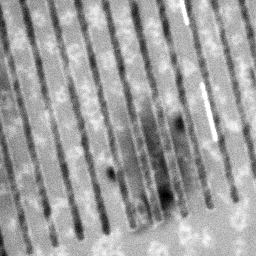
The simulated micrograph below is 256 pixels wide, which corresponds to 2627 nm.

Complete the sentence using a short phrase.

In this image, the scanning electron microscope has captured parallel lines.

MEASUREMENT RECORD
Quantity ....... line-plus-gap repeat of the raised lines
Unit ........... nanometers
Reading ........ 272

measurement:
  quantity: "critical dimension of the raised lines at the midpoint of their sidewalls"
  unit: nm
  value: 90.9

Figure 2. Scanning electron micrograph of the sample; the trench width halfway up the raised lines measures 181 nanometers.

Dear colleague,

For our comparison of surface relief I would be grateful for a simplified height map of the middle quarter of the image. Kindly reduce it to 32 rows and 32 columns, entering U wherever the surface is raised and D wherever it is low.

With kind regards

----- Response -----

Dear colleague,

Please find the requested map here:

UUDDDDUUDDDDDUUDDDDDUUDDDDDUUDDD
UUDDDDDUUDDDDUUUDDDDUUUDDDDUUDDD
UUDDDDDUUDDDDDUUDDDDUUUDDDDUUUDD
UUUDDDDUUDDDDDUUDDDDDUUDDDDUUUDD
UUUDDDDUUDDDDDUUDDDDDUUDDDDDUUDD
UUUDDDDDUUDDDDUUUDDDDUUUDDDDUUDD
DUUDDDDDUUDDDDDUUDDDDUUUDDDDUUUD
DUUUDDDDUUDDDDDUUDDDDDUUDDDDUUUD
DUUUDDDDUUDDDDDUUDDDDDUUDUDDDUUD
DUUUDDDDUUUDDDDUUUDDDDUUUDDUDUUD
DDUUDDDDDUUDDDDDUUDDDDUUUDDUDUUU
DDUUDDDDDUUDDDDDUUDDDDDUUDDDDUUU
DDUUUDDDDUUDDDDDUUDDDDDUUDDDDDUU
DDDUUDDDDDUUDDDDUUUDDDDUUUDDDDUU
DDDUUDDDDDUUDDDDDUUDDDDUUUDDDDUU
DDDUUUDDDDUUDDDDDUUDDDDDUUDDDDUU
DDDUUUDDDDUUUDDDDUUDDDDDUUDDDDDU
DDDDUUDDDDDUUDDDDUUUDDDDUUUDDDDU
DDDDUUDDDDDUUDDDDDUUDDDDUUUDDDDU
DDDDUUDDDDDUUDDDDDUUDDDDDUUDDDDU
DDDDUUUDDDDUUDDDDDUUDDDDDUUDDDDD
DDDDDUUDDDDUUUDDDDUUDDDDDUUUDDDD
DDDDDUUDDDDDUUDDDDDUUDDDDUUUDDDD
UDDDDUUDDDDDUUDDDDDUUDDDDDUUDDDD
UDDDDUUUUDDDUUUDDDDUUDDDDDUUDDDD
UDDDDDUUDDDDUUUDDDDUUDDDDDUUUDDD
UDDDDDUUDDDDDUUDDDDUUUDDDDUUUDDD
UDDDDDUUDDDDDUUDDDDDUUDDDDDUUDDD
UDDDDDUUUDDDDUUDDDDDUUDDDDDUUDDD
UUDDDDDUUDDDDUUUDDDDUUDDDDDUUUDD
UUDDDDDUUDDDDDUUDDDDUUUDDDDUUUDD
UUDDDDDUUDDDDDUUDDDDDUUDDDDDUUDD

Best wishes